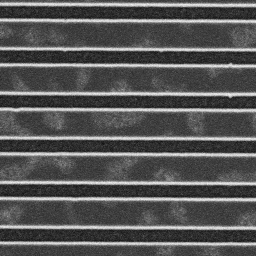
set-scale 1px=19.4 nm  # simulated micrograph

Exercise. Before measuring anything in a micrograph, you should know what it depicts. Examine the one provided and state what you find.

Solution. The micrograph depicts parallel lines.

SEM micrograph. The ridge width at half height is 564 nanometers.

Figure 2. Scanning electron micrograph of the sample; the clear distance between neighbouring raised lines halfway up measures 308 nanometers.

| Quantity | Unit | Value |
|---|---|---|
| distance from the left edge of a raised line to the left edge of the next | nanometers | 864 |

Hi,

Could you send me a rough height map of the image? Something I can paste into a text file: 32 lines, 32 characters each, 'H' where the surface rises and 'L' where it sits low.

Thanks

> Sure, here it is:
HHLLLHHHHLHHHHHHHHHHHHHHHHHHHHHH
LLLLLLLLLLLLLLLLLLLLLLLLLLLLLLLL
LLLLLLLLLLLLLLLLLLLLLLLLLLLLLLLL
HHHHHHHHHHHHHHHHHHHHHHHHHHHHHHHH
HHHHHHHHHHHHHHHHHHHHHHHHHHHHHHHH
HHHHHHHHHHHHHHHHHHHHHHHHHHHHHHHH
LLLLLLLLLLLLLLLLLLLLLLLLLLLLLLLL
LLLLLLLLLLLLLLLLLLLLLLLLLLLLLLLL
HHHHHHHHHHHHHHHHHHHHHHHHHHHHHHHH
HHHHHHHHHHHHHHHHHHHHHHHHHHHHHHHH
HHHHHHHHHHHHHHHHHHHHHHHHHHHHHHHH
HHHHHHHHHHHHHHHHHHHHHHHHHHHHHHHH
LLLLLLLLLLLLLLLLLLLLLLLLLLLLLLLL
LLLLLLLLLLLLLLLLLLLLLLLLLLLLLLLL
HHHHHHHHHHHHHHHHHHHHHHHHHHHHHHHH
HHHHHHHHHHHHHHHHHHHHHHHHHHHHHHHH
HHHHHHHHHHHHHHHHHHHHHHHHHHHHHHHH
LLLLLLLLLLLLLLLLLLLLLLLLLLLLLLLL
LLLLLLLLLLLLLLLLLLLLLLLLLLLLLLLL
HHHHHHHHHHHHHHHHHHHHHHHHHHHHHHHH
HHHHHHHHHHHHHHHHHHHHHHHHHHHHHHHH
HHHHHHHHHHHHHHHHHHHHHHHHHHHHHHHH
HHHHHHHHHHHHHHHHHHHHHHHHHHHHHHHH
LLLLLLLLLLLLLLLLLLLLLLLLLLLLLLLL
LLLLLLLLLLLLLLLLLLLLLLLLLLLLLLLL
HHHHHHHHHHHHHHHHHHHHHHHHHHHHHHHH
HHHHHHHHHHHHHHHHHHHHHHHHHHHHHHHH
HHHHHHHHHHHHHHHHHHHHHHHHHHHHHHHH
LLLLLLLLLLLLLLLLLLLLLLLLLLLLHHHH
LLLLLLLLLLLLLLLLLLLLLLLLLLLLLLLL
HHHHHHHHHHHHHHHHHHHHHHHHHHHHLLLL
HHHHHHHHHHHHHHHHHHHHHHHHHHHHHHHH